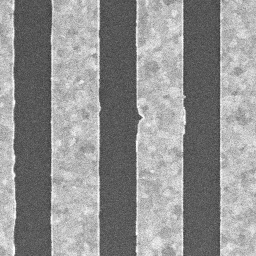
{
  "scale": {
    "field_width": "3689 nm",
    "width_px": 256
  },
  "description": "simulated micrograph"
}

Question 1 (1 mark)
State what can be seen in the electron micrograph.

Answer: one or a few lines or trenches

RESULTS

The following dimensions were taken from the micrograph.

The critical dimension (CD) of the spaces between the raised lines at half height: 550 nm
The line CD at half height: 667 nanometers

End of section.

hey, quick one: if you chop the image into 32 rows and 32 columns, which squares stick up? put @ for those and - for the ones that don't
@@-----@@@@@-----@@@@@@-----@@@@
@@-----@@@@@-----@@@@@@-----@@@@
@@-----@@@@@-----@@@@@@-----@@@@
@@-----@@@@@-----@@@@@@-----@@@@
@@----@@@@@@-----@@@@@@-----@@@@
@@----@@@@@@-----@@@@@@-----@@@@
@@----@@@@@@-----@@@@@@-----@@@@
@@-----@@@@@-----@@@@@@-----@@@@
@@-----@@@@@-----@@@@@@-----@@@@
@@----@@@@@@-----@@@@@@-----@@@@
@@----@@@@@@-----@@@@@@-----@@@@
@@----@@@@@@-----@@@@@@-----@@@@
@@----@@@@@@-----@@@@@@-----@@@@
@@----@@@@@@-----@@@@@@-----@@@@
@@----@@@@@@------@@@@@-----@@@@
@@----@@@@@@-----@@@@@@-----@@@@
@@-----@@@@@-----@@@@@@-----@@@@
@@-----@@@@@-----@@@@@@-----@@@@
@@-----@@@@@-----@@@@@@-----@@@@
@@-----@@@@@-----@@@@@@-----@@@@
@@-----@@@@@-----@@@@@@-----@@@@
@@-----@@@@@-----@@@@@@-----@@@@
@@-----@@@@@-----@@@@@@-----@@@@
@@-----@@@@@-----@@@@@@-----@@@@
@@-----@@@@@-----@@@@@@-----@@@@
@@----@@@@@@-----@@@@@@-----@@@@
@@----@@@@@@-----@@@@@@-----@@@@
@@----@@@@@@-----@@@@@@-----@@@@
@@----@@@@@@-----@@@@@@-----@@@@
@@-----@@@@@-----@@@@@@-----@@@@
@@-----@@@@@-----@@@@@@-----@@@@
@@-----@@@@@-----@@@@@@-----@@@@